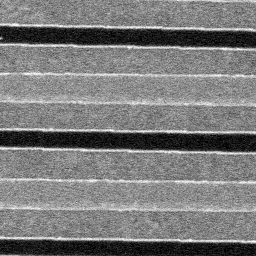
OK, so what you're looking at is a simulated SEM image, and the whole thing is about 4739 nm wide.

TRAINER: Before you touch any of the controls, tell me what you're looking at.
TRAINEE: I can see lines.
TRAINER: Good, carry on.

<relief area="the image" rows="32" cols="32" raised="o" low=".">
................................
................................
................................
ooooooooooooooooooooo...........
oooooooooooooooooooooooooooooooo
oooooooooooooooooooooooooooooooo
................................
................................
................................
oooooooooooooooooooooooooooooo..
oooooooooooooooooooooooooooooooo
oooooooooooooooooooooooooooooooo
..oooooooooooooooooooooooooooooo
................................
................................
................................
oooooooooooooooooooooooo........
oooooooooooooooooooooooooooooooo
oooooooooooooooooooooooooooooooo
................................
................................
................................
oooooo..........................
oooooooooooooooooooooooooooooooo
oooooooooooooooooooooooooooooooo
oooooooooooooooooooooooooooooooo
................................
................................
................................
................................
oooooooooooooooooooooooooooooooo
oooooooooooooooooooooooooooooooo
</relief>